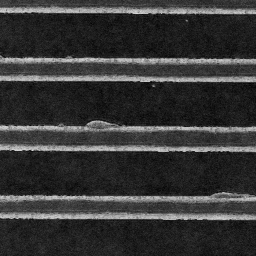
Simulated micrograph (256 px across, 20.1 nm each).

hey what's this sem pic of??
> lines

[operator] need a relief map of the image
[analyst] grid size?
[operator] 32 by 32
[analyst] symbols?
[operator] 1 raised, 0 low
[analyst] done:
11111111111111111111111111111111
00000000000000000000000000000010
00000000000000000000000000000000
00000000000000000000000000000000
00000000000000000000000000000000
00000000000000000000000000000000
00000000000000000000000000000000
11111111111110000000000000000000
11111111111111111111111111111111
11111111111111111111111111111111
00000000000000000000000000000000
00000000000000000000000000000000
00000000000000000000000000000000
00000000000000000000000000000000
00000000000000000000000000000000
00000000000110000000000000000000
11111111111111111111111111111111
11111111111111111111111111111111
01111111111111111111111111111111
00000000000000000000000000000000
00000000000000000000000000000000
00000000000000000000000000000000
00000000000000000000000000000000
00000000000000000000000000000000
00000000000000000000000000000000
11111111111111111111111111111111
11111111111111111111111111111111
00000000000000000000000000000000
00000000000000000000000000000000
00000000000000000000000000000000
00000000000000000000000000000000
00000000000000000000000000000000